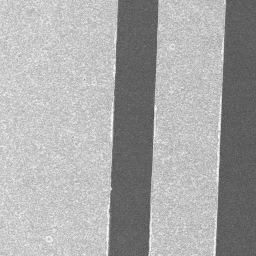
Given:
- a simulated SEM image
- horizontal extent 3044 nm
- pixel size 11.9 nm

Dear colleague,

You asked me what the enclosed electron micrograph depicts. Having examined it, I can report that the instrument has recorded one or a few lines or trenches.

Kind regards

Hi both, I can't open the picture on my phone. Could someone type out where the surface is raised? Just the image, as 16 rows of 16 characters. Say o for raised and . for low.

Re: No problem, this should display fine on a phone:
ooooooo...oooo..
ooooooo...oooo..
ooooooo...oooo..
ooooooo...oooo..
ooooooo...oooo..
ooooooo...oooo..
ooooooo..ooooo..
ooooooo...oooo..
ooooooo...oooo.o
ooooooo...oooo..
ooooooo...oooo..
ooooooo..ooooo..
ooooooo..ooooo..
ooooooo..ooooo..
ooooooo..oooo...
ooooooo..oooo...